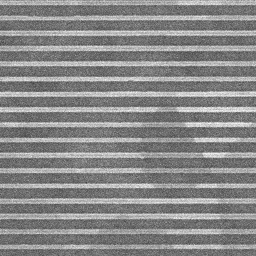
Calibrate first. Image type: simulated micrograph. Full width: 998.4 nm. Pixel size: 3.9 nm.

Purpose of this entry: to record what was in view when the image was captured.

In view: parallel lines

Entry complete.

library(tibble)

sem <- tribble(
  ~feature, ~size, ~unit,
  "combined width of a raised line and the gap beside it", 59.5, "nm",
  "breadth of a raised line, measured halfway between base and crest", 4.26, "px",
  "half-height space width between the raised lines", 43.9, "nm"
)